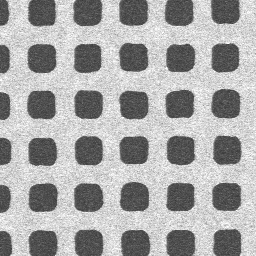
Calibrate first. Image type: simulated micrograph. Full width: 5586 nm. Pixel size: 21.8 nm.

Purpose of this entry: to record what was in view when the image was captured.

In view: a regular array of holes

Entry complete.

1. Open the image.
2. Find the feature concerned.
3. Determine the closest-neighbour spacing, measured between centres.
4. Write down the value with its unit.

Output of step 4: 997 nanometers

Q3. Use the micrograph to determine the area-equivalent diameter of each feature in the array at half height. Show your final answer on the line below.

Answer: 665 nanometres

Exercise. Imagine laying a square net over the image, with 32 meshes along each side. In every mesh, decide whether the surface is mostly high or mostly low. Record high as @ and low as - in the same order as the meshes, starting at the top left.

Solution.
-@@@---@@----@@---@@@---@@----@@
-@@----@@----@@----@@---@@----@@
-@@@---@@----@@---@@@---@@@---@@
@@@@@@@@@@@@@@@@@@@@@@@@@@@@@@@@
@@@@@@@@@@@@@@@@@@@@@@@@@@@@@@@@
@@@@@-@@@@--@@@@-@@@@@-@@@@--@@@
-@@@---@@----@@---@@@---@@----@@
-@@----@@----@@----@@---@@----@@
-@@@---@@---@@@---@@@---@@@---@@
@@@@@@@@@@@@@@@@@@@@@@@@@@@@@@@@
@@@@@@@@@@@@@@@@@@@@@@@@@@@@@@@@
@@@@--@@@@--@@@@--@@@@--@@@---@@
-@@----@@----@@---@@@---@@@---@@
-@@----@@----@@----@@---@@----@@
-@@@---@@@--@@@---@@@---@@@---@@
@@@@@@@@@@@@@@@@@@@@@@@@@@@@@@@@
@@@@@@@@@@@@@@@@@@@@@@@@@@@@@@@@
-@@@---@@@---@@---@@@---@@@---@@
-@@----@@----@@----@@---@@@---@@
-@@----@@----@@---@@@---@@@---@@
-@@@---@@@--@@@@-@@@@@--@@@--@@@
@@@@@@@@@@@@@@@@@@@@@@@@@@@@@@@@
@@@@@@@@@@@@@@@@@@@@@@@@@@@@@@@@
-@@@---@@----@@---@@@---@@@---@@
-@@@---@@----@@----@@---@@----@@
-@@@---@@----@@----@@---@@@---@@
@@@@@@@@@@@@@@@@@@@@@@@@@@@@@@@@
@@@@@@@@@@@@@@@@@@@@@@@@@@@@@@@@
@@@@@@@@@@@@@@@@@@@@@@@@@@@@@@@@
-@@@---@@----@@----@@---@@@---@@
-@@@---@@----@@----@@---@@@---@@
-@@@---@@----@@----@@---@@@---@@